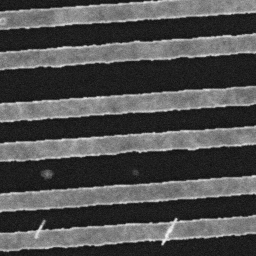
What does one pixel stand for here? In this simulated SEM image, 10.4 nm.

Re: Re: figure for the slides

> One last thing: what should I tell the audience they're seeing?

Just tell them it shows lines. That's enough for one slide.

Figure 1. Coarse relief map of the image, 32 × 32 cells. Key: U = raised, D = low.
DDDDDDDDDDDDDDUUUUUUUUUUUUUUUUUU
DUUUUUUUUUUUUUUUUUUUUUUUUUUUUUUU
UUUUUUUUUUUUUUUUUUDDDDDDDDDDDDDD
UUUUDDDDDDDDDDDDDDDDDDDDDDDDDDDD
DDDDDDDDDDDDDDDDDDDDDDDDDDDDUUUU
DDDDDDDDDDDDDDUUUUUUUUUUUUUUUUUU
UUUUUUUUUUUUUUUUUUUUUUUUUUUUUUUU
UUUUUUUUUUUUUUUUUUUDDDDDDDDDDDDD
UUUDDDDDDDDDDDDDDDDDDDDDDDDDDDDD
DDDDDDDDDDDDDDDDDDDDDDDDDDDDDDDD
DDDDDDDDDDDDDDDDDDDDDDDDDDDDDDDD
DDDDDDDDDDDDDDDDDDDDDDUUUUUUUUUU
DDDDDDDUUUUUUUUUUUUUUUUUUUUUUUUU
UUUUUUUUUUUUUUUUUUUUUUUUUDDDDDDD
UUUUUUUUUUUDDDDDDDDDDDDDDDDDDDDD
DDDDDDDDDDDDDDDDDDDDDDDDDDDDDDDD
DDDDDDDDDDDDDDDDDDDDDUUUUUUUUUUU
DDDDDDDUUUUUUUUUUUUUUUUUUUUUUUUU
UUUUUUUUUUUUUUUUUUUUUUUUUDDDDDDD
UUUUUUUUUUUDDDDDDDDDDDDDDDDDDDDD
DDDDDDDDDDDDDDDDDDDDDDDDDDDDDDDD
DDDDDDDDDDDDDDDDDDDDDDDDDDDDDDDD
DDDDDDDDDDDDDDDDDDDDDDDDDUUUUUUU
DDDDDDDDDDDDUUUUUUUUUUUUUUUUUUUU
UUUUUUUUUUUUUUUUUUUUUUUUUUUUDDDD
UUUUUUUUUUUUUUUDDDDDDDDDDDDDDDDD
DDDDDDDDDDDDDDDDDDDDDDDDDDDDDDDD
DDDDDDDDDDDDDDDDDDDDDDDDDUUUUUUU
DDDDDDDDDUUUUUUUUUUUUUUUUUUUUUUU
UUUUUUUUUUUUUUUUUUUUUUUUUUUUDDDD
UUUUUUUUUUUUUDDDDDDDDDDDDDDDDDDD
DDDDDDDDDDDDDDDDDDDDDDDDDDDDDDDD